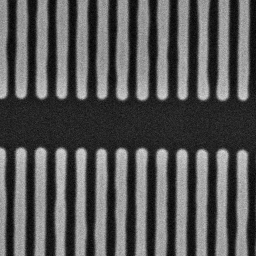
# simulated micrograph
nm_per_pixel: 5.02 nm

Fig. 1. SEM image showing groups of lines, slits or small figures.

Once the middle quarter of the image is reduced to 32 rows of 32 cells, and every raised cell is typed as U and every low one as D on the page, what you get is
UDDUUUDDUUUDDUUUDDUUUDDUUUDDDUUD
UDDUUUDDUUUDDUUUDDUUUDDUUUDDDUUD
UDDUUUDDUUUDDUUUDDUUUDDUUUDDDUUD
UDDUUUDDDUUDDUUUDDUUUDDUUUDDDUUD
UDDUUUDDDUUDDUUUDDUUUDDUUUDDDUUD
UDDUUUDDDUUDDUUUDDUUUDDUUUDDDUUD
UDDUUUDDDUUDDUUUDDUUUDDUUUDDDUUD
DDDUUUDDDUUDDUUUDDUUUDDUUUDDDUUD
DDDDUDDDDDDDDDUDDDDUDDDDUDDDDUDD
DDDDDDDDDDDDDDDDDDDDDDDDDDDDDDDD
DDDDDDDDDDDDDDDDDDDDDDDDDDDDDDDD
DDDDDDDDDDDDDDDDDDDDDDDDDDDDDDDD
DDDDDDDDDDDDDDDDDDDDDDDDDDDDDDDD
DDDDDDDDDDDDDDDDDDDDDDDDDDDDDDDD
DDDDDDDDDDDDDDDDDDDDDDDDDDDDDDDD
DDDDDDDDDDDDDDDDDDDDDDDDDDDDDDDD
DDDDDDDDDDDDDDDDDDDDDDDDDDDDDDDD
DDDDDDDDDDDDDDDDDDDDDDDDDDDDDDDD
DDDDDDDDDDDDDDDDDDDDDDDDDDDDDDDD
DDDDDDDDDDDDDDDDDDDDDDDDDDDDDDDD
DDDDDDDDDDDDDDDDDDDDDDDDDDDDDDDD
DDDDUDDDDUDDDDUDDDDUDDDDUDDDDDDD
DDDUUDDDUUUDDUUUDDUUUDDUUUDDUUUD
DDDUUDDDUUUDDUUUDDUUUDDUUUDDUUUD
DDDUUDDDUUUDDUUUDDUUUDDUUUDDUUUD
DDDUUDDDUUUDDUUDDDUUDDDUUUDDUUUD
DDDUUDDDUUUDDUUDDDUUDDDUUUDDUUUD
DDDUUDDDUUUDDUUDDDUUDDDUUDDDUUUD
DDDUUDDDUUUDDUUDDDUUDDDUUUDDUUUD
DDDUUDDDUUUDDUUDDDUUDDDUUUDDUUUD
DDDUUDDDUUUDDUUDDDUUDDDUUUDDUUUD
DDDUUDDDUUUDDUUDDDUUDDDUUUDDUUUD